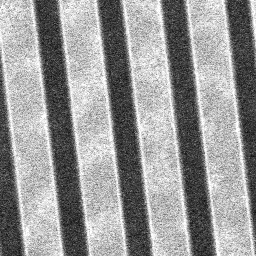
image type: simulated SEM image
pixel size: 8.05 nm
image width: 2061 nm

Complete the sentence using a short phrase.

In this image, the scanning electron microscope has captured parallel lines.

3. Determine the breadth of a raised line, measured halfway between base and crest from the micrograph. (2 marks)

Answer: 318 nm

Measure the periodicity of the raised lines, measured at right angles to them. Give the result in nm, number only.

509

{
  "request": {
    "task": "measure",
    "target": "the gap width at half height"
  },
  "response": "0.199 um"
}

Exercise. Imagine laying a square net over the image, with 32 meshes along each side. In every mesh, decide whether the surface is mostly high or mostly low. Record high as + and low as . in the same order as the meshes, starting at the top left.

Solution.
++++...+++++...+++++...+++++...+
++++...+++++...+++++...+++++...+
++++....++++....++++...+++++....
+++++...+++++...+++++...+++++...
+++++...+++++...+++++...+++++...
+++++...+++++...+++++...+++++...
+++++...+++++...+++++...+++++...
+++++...+++++...+++++...+++++...
+++++...+++++...+++++...+++++...
+++++...+++++...+++++...+++++...
.++++....++++....++++...+++++...
.+++++...+++++...++++....++++...
.+++++...+++++...+++++...+++++..
.+++++...+++++...+++++...+++++..
.+++++...+++++...+++++...+++++..
.+++++...+++++...+++++...+++++..
.+++++...+++++...+++++...+++++..
.+++++...+++++...+++++...+++++..
..++++...+++++...+++++...+++++..
..+++++...++++....++++...+++++..
..+++++...+++++...+++++...+++++.
..+++++...+++++...+++++...+++++.
..+++++...+++++...+++++...+++++.
..+++++...+++++...+++++...+++++.
..+++++...+++++...+++++...+++++.
..+++++...+++++...+++++...+++++.
..+++++...+++++...+++++...+++++.
...++++....++++....++++...+++++.
...+++++...+++++...++++....+++++
...+++++...+++++...+++++...+++++
...+++++...+++++...+++++...+++++
...+++++...+++++...+++++...+++++